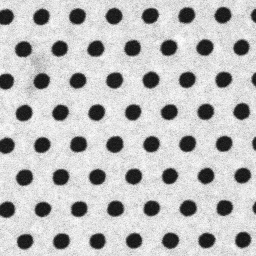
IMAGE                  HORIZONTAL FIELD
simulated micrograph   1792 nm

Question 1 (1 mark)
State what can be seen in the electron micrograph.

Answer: a regular array of holes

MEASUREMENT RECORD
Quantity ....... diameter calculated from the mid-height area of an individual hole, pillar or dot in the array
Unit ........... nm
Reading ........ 117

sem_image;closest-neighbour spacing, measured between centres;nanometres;254